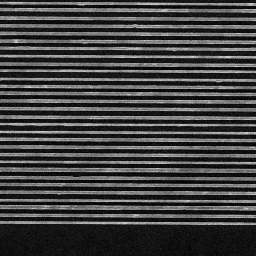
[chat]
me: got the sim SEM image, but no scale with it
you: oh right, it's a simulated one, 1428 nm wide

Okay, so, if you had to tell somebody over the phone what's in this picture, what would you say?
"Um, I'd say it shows parallel lines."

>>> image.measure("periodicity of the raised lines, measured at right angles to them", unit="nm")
42.2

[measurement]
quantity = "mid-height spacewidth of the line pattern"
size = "23.7 nm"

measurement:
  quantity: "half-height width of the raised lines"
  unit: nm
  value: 18.8